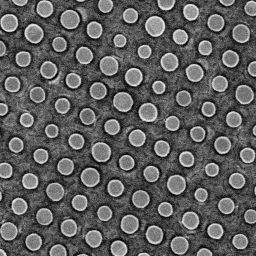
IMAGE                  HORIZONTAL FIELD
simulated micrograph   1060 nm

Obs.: a regular array of raised bodies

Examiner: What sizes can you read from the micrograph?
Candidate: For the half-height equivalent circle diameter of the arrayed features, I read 64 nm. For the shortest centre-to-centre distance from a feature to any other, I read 112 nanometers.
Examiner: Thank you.